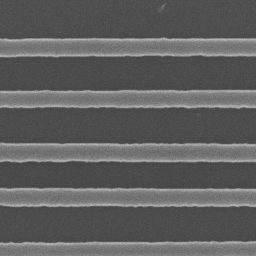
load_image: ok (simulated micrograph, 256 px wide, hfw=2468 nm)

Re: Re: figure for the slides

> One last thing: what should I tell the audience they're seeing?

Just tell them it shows lines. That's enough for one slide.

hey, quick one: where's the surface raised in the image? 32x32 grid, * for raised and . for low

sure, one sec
................................
................................
................................
................................
................................
********************************
********************************
................................
................................
................................
................................
********************************
********************************
................................
................................
................................
................................
................................
********************************
********************************
................................
................................
................................
................................
********************************
********************************
................................
................................
................................
................................
********************************
********************************